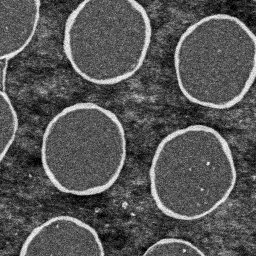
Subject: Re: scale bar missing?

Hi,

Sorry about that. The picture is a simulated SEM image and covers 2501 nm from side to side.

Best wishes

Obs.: raised bodies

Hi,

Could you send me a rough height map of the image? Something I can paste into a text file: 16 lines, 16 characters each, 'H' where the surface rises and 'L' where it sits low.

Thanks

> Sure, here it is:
HHLLLHHHHLLLLLLL
HHLLHHHHHLLLHHHL
HHLLHHHHHLLHHHHH
HLLLHHHHHLLHHHHH
LLLLLHHHLLLHHHHH
LLLLLLLLLLLHHHHL
HLLLLLLLLLLLLHLL
HLLHHHHLLLLLLLLL
HLLHHHHHLLLHHHLL
LLLHHHHHLLHHHHLL
LLLHHHHHLLHHHHHL
LLLLHHHLLLHHHHHL
LLLLLLLLLLHHHHLL
LLLLLLLLLLLHHLLL
LLHHHHLLLLLLLLLL
LLHHHHLLLHHHLLLL